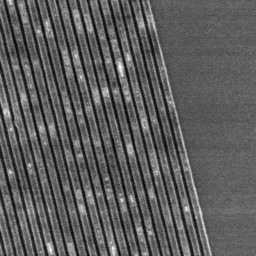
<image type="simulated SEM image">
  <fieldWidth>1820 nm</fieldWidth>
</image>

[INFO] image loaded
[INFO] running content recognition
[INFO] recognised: parallel lines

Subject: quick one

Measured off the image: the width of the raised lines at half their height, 6.43 px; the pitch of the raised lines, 71.8 nm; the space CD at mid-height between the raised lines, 3.64 px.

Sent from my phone